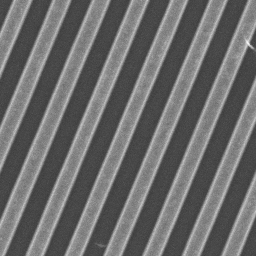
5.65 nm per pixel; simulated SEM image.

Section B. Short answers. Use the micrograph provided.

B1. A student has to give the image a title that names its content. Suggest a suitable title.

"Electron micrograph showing parallel lines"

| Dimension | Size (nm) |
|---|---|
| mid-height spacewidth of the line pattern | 116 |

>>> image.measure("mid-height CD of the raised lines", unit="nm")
88.7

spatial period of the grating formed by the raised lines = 0.204 micrometres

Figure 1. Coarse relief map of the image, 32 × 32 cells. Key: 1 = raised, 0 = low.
00110001100111001100011000110001
01100011000110001100011000110001
01100011000110001000110001100011
11000110001100011000110001100011
11000110001100011000110011000110
11001110011000110001100011000110
10001100011000110001100011001110
10001100111001100011000110001100
00011000110001100011000110001100
00011000110001100010001100011000
00110001100011000110001100011000
00110001100011000110011100110001
00110011100110001100011000110001
01100011000110001100011000110011
01100011000110011000110001100011
11000110001100011000110001100011
11000110001100011001110011000110
11001110011000110001100011000110
10001100011000110001100111001100
10011100110001100011000110001100
00011000110001100011000110001100
00011000110001100110001100011000
00110001100011000110001100011000
00110001100011000110011100110001
01110011000110001100011000110001
01100011000110001100011001110011
01100011001100011000110001100011
11000110001100011000110001100011
11000110001100111001100011000110
11001100011000110001100011000110
10001100011000110001100111001100
10001000110001100011000110001100